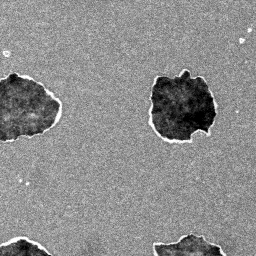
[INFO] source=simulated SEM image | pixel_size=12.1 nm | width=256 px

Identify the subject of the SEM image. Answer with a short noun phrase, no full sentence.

holes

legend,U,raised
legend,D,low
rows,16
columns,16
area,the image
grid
UUUUUUUUUUUUUUUU
UUUUUUUUUUUUUUUU
UUUUUUUUUUUUUUUU
UUUUUUUUUUUUUUUU
UUUUUUUUUUUUUUUU
DDDUUUUUUUDDDUUU
DDDDUUUUUDDDDUUU
DDDDUUUUUDDDDUUU
DDUUUUUUUUDDUUUU
UUUUUUUUUUUUUUUU
UUUUUUUUUUUUUUUU
UUUUUUUUUUUUUUUU
UUUUUUUUUUUUUUUU
UUUUUUUUUUUUUUUU
UUUUUUUUUUUUUUUU
DDDUUUUUUUDDDDUU